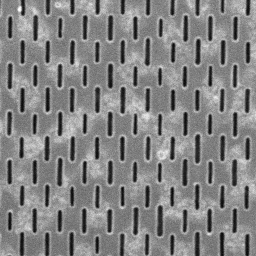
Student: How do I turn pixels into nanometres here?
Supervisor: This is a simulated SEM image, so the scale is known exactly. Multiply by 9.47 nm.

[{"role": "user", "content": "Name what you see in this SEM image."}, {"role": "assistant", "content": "a regular array of holes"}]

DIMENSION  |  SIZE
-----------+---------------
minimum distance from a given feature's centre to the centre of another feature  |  234 nm